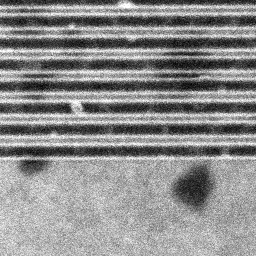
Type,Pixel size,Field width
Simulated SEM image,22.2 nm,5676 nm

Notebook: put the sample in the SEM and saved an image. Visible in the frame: parallel lines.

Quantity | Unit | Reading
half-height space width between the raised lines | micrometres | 0.141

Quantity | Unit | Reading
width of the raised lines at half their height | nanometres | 346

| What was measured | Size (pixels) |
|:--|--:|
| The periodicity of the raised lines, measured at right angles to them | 21.7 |